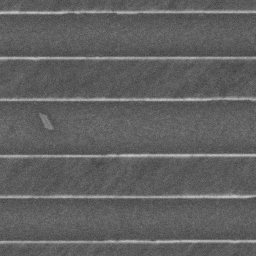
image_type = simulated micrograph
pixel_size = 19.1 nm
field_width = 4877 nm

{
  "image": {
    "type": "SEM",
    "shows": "lines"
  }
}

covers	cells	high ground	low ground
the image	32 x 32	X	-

XXXXXXXXXXXXXXXXXXXXXXXXXXXXXXXX
XXXXXXXXXXXXXXXXXXXXXXXXXXXXXXXX
--------------------------------
--------------------------------
--------------------------------
--------------------------------
--------------------------------
XXXXXXXXXXXXXXXXXXXXXXXXXXXXXXXX
XXXXXXXXXXXXXXXXXXXXXXXXXXXXXXXX
XXXXXXXXXXXXXXXXXXXXXXXXXXXXXXXX
XXXXXXXXXXXXXXXXXXXXXXXXXXXXXXXX
XXXXXXXXXXXXXXXXXXXXXXXXXXXXXXXX
--------------------------------
--------------------------------
--------------------------------
--------------------------------
--------------------------------
--------------------------------
--------------------------------
-----------------XXXXXXXXXXXXXXX
XXXXXXXXXXXXXXXXXXXXXXXXXXXXXXXX
XXXXXXXXXXXXXXXXXXXXXXXXXXXXXXXX
XXXXXXXXXXXXXXXXXXXXXXXXXXXXXXXX
XXXXXXXXXXXXXXXXXXXXXXXXXXXXXXXX
XXXXXXXXXXXXXXXXXXXXXXXXXXXXXXXX
--------------------------------
--------------------------------
--------------------------------
--------------------------------
--------------------------------
XXXXXXXXXXXXXXXXXXXXXXXXXXXXXXXX
XXXXXXXXXXXXXXXXXXXXXXXXXXXXXXXX